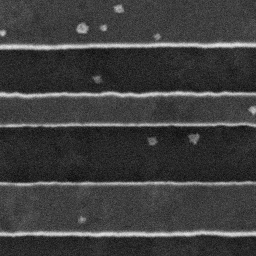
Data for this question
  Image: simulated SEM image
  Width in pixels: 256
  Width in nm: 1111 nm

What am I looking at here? lines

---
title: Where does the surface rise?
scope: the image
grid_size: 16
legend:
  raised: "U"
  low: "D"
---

UUUUUUUUUUUUUUUU
UUUUUUUUUUUUUUUU
UUUUUUUUUUUUUUUU
DDDDDDDDDDDDDDDD
DDDDDDDDDDDDDDDD
DDDDDDDDDDDDDDDD
UUUUUUUUUUUUUUUU
UUUUUUUUUUUUUUUU
DDDDDDDDDDDDDDDD
DDDDDDDDDDDDDDDD
DDDDDDDDDDDDDDDD
UUUUUUUUUUUUUUUU
UUUUUUUUUUUUUUUU
UUUUUUUUUUUUUUUU
UUUUUUUUUUUUUUUU
DDDDDDDDDDDDDDDD